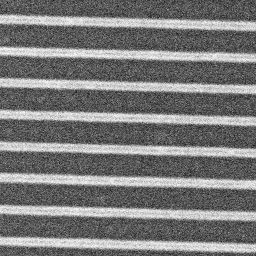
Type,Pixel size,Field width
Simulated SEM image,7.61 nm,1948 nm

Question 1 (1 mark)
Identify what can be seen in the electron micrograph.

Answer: parallel lines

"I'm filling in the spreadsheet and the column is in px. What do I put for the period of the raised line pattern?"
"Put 31.7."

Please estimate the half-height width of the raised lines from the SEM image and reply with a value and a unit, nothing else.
0.0523 micrometres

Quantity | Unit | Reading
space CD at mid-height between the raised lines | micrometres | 0.184